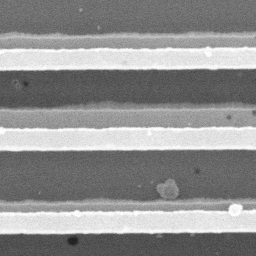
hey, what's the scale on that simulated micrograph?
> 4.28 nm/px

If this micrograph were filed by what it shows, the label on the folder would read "lines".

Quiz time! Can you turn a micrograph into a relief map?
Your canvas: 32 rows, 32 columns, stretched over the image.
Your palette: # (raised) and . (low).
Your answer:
................................
................................
................................
................................
.#............#####.##.#########
################################
################################
################################
################################
................................
................................
................................
................................
..........................#.###.
################################
################################
################################
################################
################################
................................
................................
................................
................................
................................
................................
################################
################################
################################
################################
................................
................................
................................